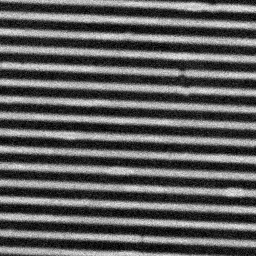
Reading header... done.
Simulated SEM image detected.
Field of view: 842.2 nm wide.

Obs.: parallel lines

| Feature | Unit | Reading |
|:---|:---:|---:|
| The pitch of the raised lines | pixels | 16.7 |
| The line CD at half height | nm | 21.7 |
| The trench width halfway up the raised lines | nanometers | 34.5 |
